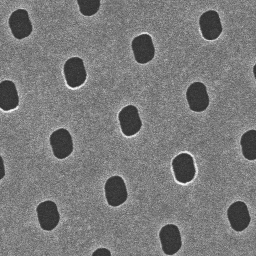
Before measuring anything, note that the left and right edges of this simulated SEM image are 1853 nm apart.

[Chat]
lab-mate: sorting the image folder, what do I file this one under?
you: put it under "a regular array of holes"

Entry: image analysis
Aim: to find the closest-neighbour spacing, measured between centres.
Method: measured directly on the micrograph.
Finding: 520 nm